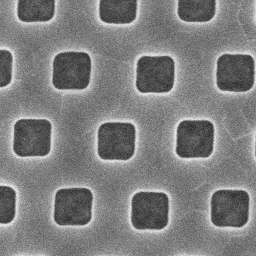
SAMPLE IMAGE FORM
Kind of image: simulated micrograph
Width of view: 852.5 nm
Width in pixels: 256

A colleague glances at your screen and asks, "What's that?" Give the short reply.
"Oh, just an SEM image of a regular array of holes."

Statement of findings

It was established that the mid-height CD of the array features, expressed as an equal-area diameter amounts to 138 nm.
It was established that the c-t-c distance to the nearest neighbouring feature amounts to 257 nanometers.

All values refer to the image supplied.